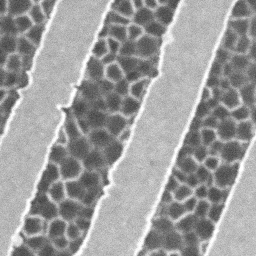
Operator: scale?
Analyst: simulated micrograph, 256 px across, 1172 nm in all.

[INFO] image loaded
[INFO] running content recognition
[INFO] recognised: one or a few lines or trenches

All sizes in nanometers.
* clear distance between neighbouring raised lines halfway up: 298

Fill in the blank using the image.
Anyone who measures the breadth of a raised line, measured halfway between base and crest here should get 0.227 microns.